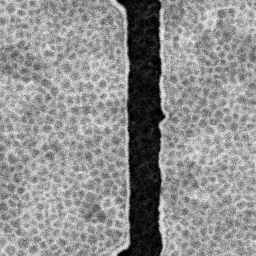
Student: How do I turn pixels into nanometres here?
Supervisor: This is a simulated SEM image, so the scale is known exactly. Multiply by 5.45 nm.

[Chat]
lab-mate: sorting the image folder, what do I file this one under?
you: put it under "one or a few lines or trenches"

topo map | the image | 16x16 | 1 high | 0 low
1111111100111111
1111111100111111
1111111100111111
1111111100111111
1111111100111111
1111111100111111
1111111100111111
1111111100111111
1111111100111111
1111111100111111
1111111100111111
1111111100111111
1111111100111111
1111111100111111
1111111100111111
1111111100111111